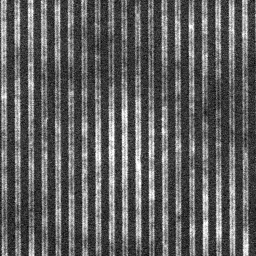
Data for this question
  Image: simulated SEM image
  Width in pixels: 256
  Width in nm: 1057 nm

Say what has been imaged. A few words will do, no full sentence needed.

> parallel lines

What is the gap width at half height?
8.62 pixels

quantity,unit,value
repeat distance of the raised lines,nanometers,55.4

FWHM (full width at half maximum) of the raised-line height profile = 18.1 nanometers